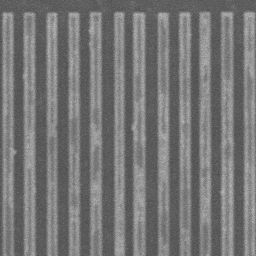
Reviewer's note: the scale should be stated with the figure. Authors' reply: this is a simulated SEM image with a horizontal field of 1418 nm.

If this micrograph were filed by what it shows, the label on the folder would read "parallel lines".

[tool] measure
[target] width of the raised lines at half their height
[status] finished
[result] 0.0471 um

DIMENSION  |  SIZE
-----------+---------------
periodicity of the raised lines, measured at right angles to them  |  0.122 um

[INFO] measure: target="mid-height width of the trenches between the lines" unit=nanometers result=74.1